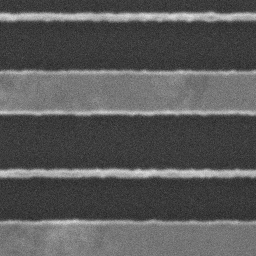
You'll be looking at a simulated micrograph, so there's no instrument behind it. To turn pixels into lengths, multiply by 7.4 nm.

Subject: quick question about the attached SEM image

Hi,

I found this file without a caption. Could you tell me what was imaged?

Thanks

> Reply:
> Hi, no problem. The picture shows lines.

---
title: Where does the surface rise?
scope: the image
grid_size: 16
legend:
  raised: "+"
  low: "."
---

................
................
................
................
++++++++++.++.++
++++++++++++++++
++++++++++++++++
................
................
................
................
................
................
................
++++++++++++++++
++++++++++++++++